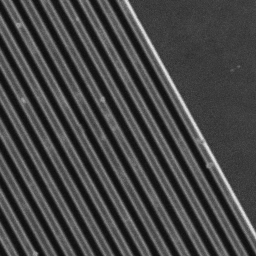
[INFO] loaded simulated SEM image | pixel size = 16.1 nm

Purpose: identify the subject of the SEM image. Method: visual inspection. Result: parallel lines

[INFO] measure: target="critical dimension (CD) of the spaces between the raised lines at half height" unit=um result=0.139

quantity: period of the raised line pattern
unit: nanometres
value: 270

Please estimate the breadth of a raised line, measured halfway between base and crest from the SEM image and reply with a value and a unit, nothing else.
125 nm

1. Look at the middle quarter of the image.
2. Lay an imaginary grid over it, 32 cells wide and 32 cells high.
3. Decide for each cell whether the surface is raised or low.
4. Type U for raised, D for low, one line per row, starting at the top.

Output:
UDDUUDDDUUDDDUUDDDUUDDUUUDDDDDDD
UDDDUUDDDUUDDUUUDDUUDDDUUDDDDDDD
UUDDUUDDDUUDDDUUDDDUUDDUUUDDDDDD
UUDDDUUDDDUUDDUUUDDUUDDDUUDDDDDD
UUUDDUUDDDUUDDDUUDDDUUDDDUUDDDDD
DUUDDDUUDDDUUDDUUUDDUUDDDUUDDDDD
DUUUDDUUDDDUUDDDUUDDDUUDDDUUDDDD
DDUUUDDUUDDDUUDDDUUDDUUUDDUUDDDD
DDDUUDDUUUDDUUUDDUUDDDUUDDDUUDDD
UDDUUUDDUUDDDUUDDDUUDDDUUDDUUDDD
UDDDUUDDDUUDDUUUDDUUUDDUUDDDUUDD
UUDDUUUDDUUDDDUUDDDUUDDDUUDDUUDD
UUDDDUUDDDUUDDDUUDDUUUDDUUDDDUUD
DUUDDUUUDDUUUDDUUDDDUUDDDUUDDUUU
DUUDDDUUDDDUUDDDUUDDUUUDDUUDDDUU
DDUUDDDUUDDUUUDDUUDDDUUDDDUUDDDU
DDUUUDDUUUDDUUDDDUUDDUUUDDUUUDDU
DDDUUDDDUUDDUUUDDUUDDDUUDDDUUDDD
UDDDUUDDUUUDDUUDDDUUDDDUUDDDUUDD
UUDDUUDDDUUDDDUUDDUUUDDUUDDDUUDD
UUDDDUUDDUUUDDUUDDDUUDDDUUDDDUUD
UUUDDUUDDDUUDDDUUDDDUUDDUUUDDUUD
DUUDDDUUDDUUUDDUUUDDUUDDDUUDDDUU
DUUUDDUUDDDUUDDDUUDDDUUDDUUUDDUU
DDUUDDDUUDDUUUDDUUDDDUUDDDUUDDDU
DDDUUDDUUUDDUUDDDUUDDDUUDDUUUDDU
DDDUUDDDUUDDUUUDDUUDDDUUDDDUUDDD
UDDDUUDDDUUDDUUUDDUUDDDUUDDDUUDD
UUDDUUUDDUUDDDUUDDUUUDDUUUDDUUDD
UUDDDUUDDDUUDDUUUDDUUDDDUUDDDUUD
DUUDDUUUDDUUDDDUUDDDUUDDDUUDDUUU
DUUDDDUUDDDUUDDUUUDDUUDDDUUDDDUU